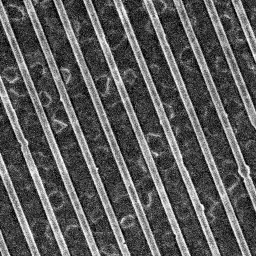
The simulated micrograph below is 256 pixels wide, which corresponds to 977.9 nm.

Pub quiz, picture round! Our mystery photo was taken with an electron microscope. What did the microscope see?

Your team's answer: parallel lines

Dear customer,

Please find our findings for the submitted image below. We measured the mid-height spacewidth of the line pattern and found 0.0811 micrometres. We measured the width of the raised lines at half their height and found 25.8 nanometers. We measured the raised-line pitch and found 107 nm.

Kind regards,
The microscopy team